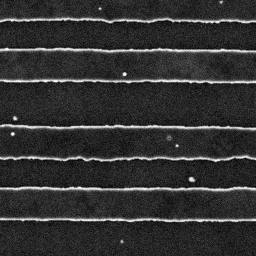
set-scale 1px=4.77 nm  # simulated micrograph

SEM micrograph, lines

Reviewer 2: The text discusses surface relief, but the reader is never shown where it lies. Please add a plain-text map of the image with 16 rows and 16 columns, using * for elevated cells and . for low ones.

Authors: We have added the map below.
****************
................
................
****************
****************
................
................
................
****************
****************
................
................
****************
****************
................
................